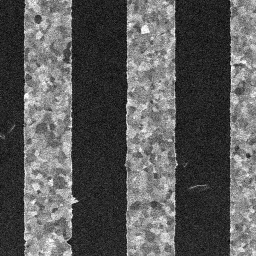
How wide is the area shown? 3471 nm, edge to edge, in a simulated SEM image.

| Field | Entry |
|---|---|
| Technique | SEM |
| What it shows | one or a few lines or trenches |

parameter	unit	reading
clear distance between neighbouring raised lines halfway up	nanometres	756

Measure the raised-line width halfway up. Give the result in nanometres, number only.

637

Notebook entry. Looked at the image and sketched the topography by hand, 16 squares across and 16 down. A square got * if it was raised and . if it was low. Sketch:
..**....***...**
..**....***...**
..**....***...**
..**....***...**
..**....***...**
..**....***...**
..**....***...**
..**....***...**
..**....***...**
..**....***...**
..**....***...**
..**....***...**
..***...***...**
..**....***...**
..**....***...**
..**....***...**